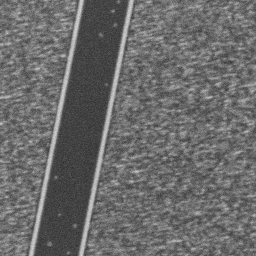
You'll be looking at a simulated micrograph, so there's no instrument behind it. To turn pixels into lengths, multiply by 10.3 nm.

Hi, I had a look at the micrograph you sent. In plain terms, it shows one or a few lines or trenches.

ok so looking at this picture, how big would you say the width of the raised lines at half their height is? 511 nm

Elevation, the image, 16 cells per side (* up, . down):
.....***........
.....***........
.....***........
....****........
....***.........
....***.........
....***.........
....***.........
...****.........
...***..........
...***..........
...***..........
...***..........
..****..........
..***...........
..***...........